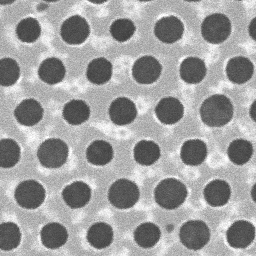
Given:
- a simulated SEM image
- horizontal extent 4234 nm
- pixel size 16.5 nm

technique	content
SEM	a regular array of holes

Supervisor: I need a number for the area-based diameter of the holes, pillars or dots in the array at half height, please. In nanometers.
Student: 481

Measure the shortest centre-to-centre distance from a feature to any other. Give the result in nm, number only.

771